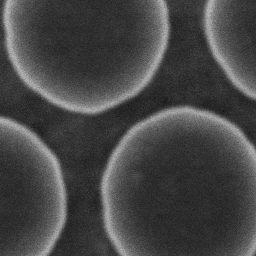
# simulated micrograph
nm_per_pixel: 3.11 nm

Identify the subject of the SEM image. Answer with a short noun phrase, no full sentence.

raised bodies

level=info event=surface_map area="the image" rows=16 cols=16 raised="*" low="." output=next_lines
**********...***
**********...***
.*********...***
.*********....**
.*********....**
..*******......*
....***.........
.........*****..
**......*******.
***....*********
****...*********
****..**********
****...*********
****...*********
****...*********
***....*********